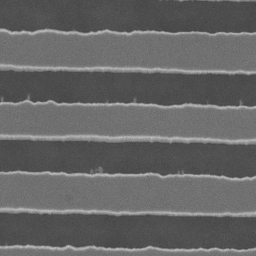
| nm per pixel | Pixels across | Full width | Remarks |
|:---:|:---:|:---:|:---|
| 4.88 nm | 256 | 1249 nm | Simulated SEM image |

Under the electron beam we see lines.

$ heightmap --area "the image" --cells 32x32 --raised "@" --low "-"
--------------------------------
--------------------------------
--------------------------------
--------------------------------
@@@@@@@@@@@@@@@@@@@@@@@@@@@@@@@@
@@@@@@@@@@@@@@@@@@@@@@@@@@@@@@@@
@@@@@@@@@@@@@@@@@@@@@@@@@@@@@@@@
@@@@@@@@@@@@@@@@@@@@@@@@@@@@@@@@
-@@@@@@@@@@@@@@@@@@@@@@@@@@@@@@@
--------------------------------
--------------------------------
--------------------------------
--------------------------------
@@@@@@@@@@@@@@@@@@@@@@@@@@@@@@@@
@@@@@@@@@@@@@@@@@@@@@@@@@@@@@@@@
@@@@@@@@@@@@@@@@@@@@@@@@@@@@@@@@
@@@@@@@@@@@@@@@@@@@@@@@@@@@@@@@@
-------------@@-----@@@@@@@@@@@@
--------------------------------
--------------------------------
--------------------------------
-@@@-@--------------------------
@@@@@@@@@@@@@@@@@@@@@@@@@@@@@@@@
@@@@@@@@@@@@@@@@@@@@@@@@@@@@@@@@
@@@@@@@@@@@@@@@@@@@@@@@@@@@@@@@@
@@@@@@@@@@@@@@@@@@@@@@@@@@@@@@@@
-@@@@@@@@@@@@@@@@@@@@@@@@@@@@@@@
--------------------------------
--------------------------------
--------------------------------
--------------------------------
@@@@@@@@@@@@@@@@@@@@@@@@@@@@@@@@